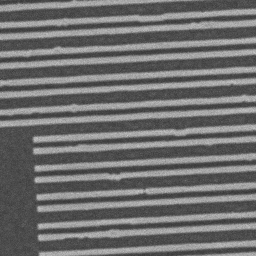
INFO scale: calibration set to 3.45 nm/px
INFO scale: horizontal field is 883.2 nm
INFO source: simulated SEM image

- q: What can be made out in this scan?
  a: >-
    parallel lines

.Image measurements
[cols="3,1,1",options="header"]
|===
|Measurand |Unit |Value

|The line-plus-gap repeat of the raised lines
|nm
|49.9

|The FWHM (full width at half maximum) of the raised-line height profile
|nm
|20.3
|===